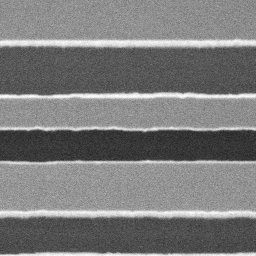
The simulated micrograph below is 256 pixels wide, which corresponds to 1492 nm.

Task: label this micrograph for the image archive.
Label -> lines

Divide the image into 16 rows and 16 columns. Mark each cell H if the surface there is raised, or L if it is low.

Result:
HHHHHHHHHHHHHHHH
HHHHHHHHHHHHHHHH
HHHHHHHHHHHHHHHH
LLLLLLLLLLLLLLLL
LLLLLLLLLLLLLLLL
LLLLLLLLLLLLLLLL
HHHHHHHHHHHHHHHH
HHHHHHHHHHHHHHHH
LLLLLLLLLLLLLLLL
LLLLLLLLLLLLLLLL
HHHHHHHHHHHHHHHH
HHHHHHHHHHHHHHHH
HHHHHHHHHHHHHHHH
LLLLLLLLLLLLLLLL
LLLLLLLLLLLLLLLL
LLLLLLLLLLLLLLLL